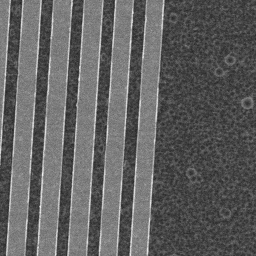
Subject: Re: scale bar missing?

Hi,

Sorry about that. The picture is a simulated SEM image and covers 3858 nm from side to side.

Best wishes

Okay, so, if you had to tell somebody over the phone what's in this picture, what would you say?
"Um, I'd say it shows parallel lines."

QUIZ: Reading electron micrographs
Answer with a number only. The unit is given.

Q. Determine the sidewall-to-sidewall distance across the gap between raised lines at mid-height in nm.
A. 180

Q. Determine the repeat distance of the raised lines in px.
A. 30.7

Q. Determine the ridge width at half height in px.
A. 18.5